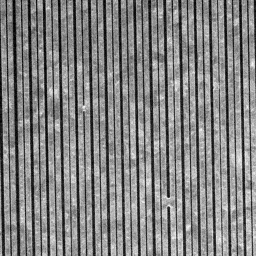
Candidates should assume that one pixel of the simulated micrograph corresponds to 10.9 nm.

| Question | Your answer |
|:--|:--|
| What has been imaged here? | parallel lines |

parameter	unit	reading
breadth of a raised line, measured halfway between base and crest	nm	51.9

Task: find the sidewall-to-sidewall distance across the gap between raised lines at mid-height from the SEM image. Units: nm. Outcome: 21.9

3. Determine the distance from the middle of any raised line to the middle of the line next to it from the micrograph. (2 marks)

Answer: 82.4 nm